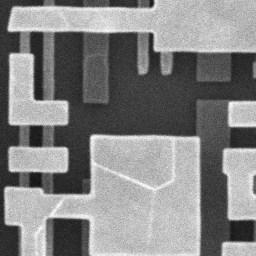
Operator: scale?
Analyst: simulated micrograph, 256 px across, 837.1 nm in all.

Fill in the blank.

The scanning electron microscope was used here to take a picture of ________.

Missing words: wiring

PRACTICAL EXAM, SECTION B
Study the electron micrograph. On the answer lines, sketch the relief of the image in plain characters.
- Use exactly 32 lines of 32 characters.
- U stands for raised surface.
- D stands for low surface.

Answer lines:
DDDDDDDDDDDDDDDDDDDUUUUUUUUUUUUU
DUUUUUUUUUUUUUUUUUUUUUUUUUUUUUUU
DUUUUUUUUUUUUUUUUUUUUUUUUUUUUUUU
DUUUUUUUUUUUUUUUUUUUUUUUUUUUUUUU
DDDDDDDDDDDDDDDDDDDUUUUUUUUUUUUU
DDDDDDDDDDDDDDDDDDDUUUUUUUUUUUUU
DDDDDDDDDDDDDDDDDDDDDDDDDUUUDUUU
DUUUDDDDDDDDDDDDDDDDDDDDDDDDDDDD
DUUUDDDDDDDDDDDDDDDDDDDDDDDDDDDD
DUUUDDDDDDDDDDDDDDDDDDDDDDDDDDDD
DUUUDDDDDDDDDDDDDDDDDDDDDDDDDDDD
DUUUDDDDDDDDDDDDDDDDDDDDDDDDDDDD
DUUUUDDDDDDDDDDDDDDDDDDDDDDDDDDD
DUUUUUUUDDDDDDDDDDDDDDDDDDDDDUUU
DUUUUUUUDDDDDDDDDDDDDDDDDDDDDUUU
DDDDUUUUDDDDDDDDDDDDDDDDDDDDDUUU
DDDDDDDDDDDDDDDDDDDDDDDDDDDDDDDD
DDDDDDDDDDDUUUUUUUUUUUUUUDDDDDDD
DUUUUUUUDDDUUUUUUUUUUUUUUDDDDDDD
DUUUUUUUDDDUUUUUUUUUUUUUUDDDUUUU
DUUUUUUUDDDUUUUUUUUUUUUUUDDDUUUU
DDDDDDUUDDDUUUUUUUUUUUUUUDDDUUUU
DDDDDDDDDDDUUUUUUUUUUUUUUDDDDUUU
DUUDDDDDDDDUUUUUUUUUUUUUUDDDDUUU
DUUUUUUUUUUUUUUUUUUUUUUUUDDDDUUU
DUUUUUUUUUUUUUUUUUUUUUUUUDDDDUUU
DUUUUUUUUUUUUUUUUUUUUUUUUDDDDUUU
DUUUUUDDDDDUUUUUUUUUUUUUUDDDDDDD
DDDUUUDDDDDUUUUUUUUUUUUUUDDDDDDD
DDDUUUDDDDDUUUUUUUUUUUUUUDDDDDDD
DDDUUUDDDDDUUUUUUUUUUUUUUDDDUUUU
DDDUUUDDDDDUUUUUUUUUUUUUUDDDUUUU